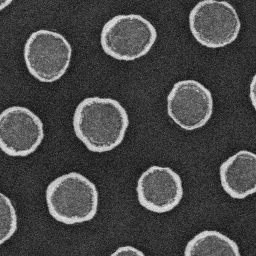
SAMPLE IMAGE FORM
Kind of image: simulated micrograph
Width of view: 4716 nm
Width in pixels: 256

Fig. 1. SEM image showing raised bodies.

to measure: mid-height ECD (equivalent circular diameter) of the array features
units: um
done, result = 0.857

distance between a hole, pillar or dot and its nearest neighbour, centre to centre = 1.53 um